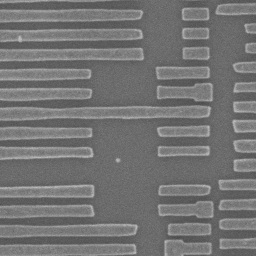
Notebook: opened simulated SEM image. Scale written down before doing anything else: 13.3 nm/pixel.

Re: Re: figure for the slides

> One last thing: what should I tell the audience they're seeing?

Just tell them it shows wiring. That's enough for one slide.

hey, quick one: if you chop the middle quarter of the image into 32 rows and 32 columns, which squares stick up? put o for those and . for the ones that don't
................................
oooooo.................ooooooooo
ooooooo................ooooooooo
ooo.....................ooo.....
................................
................................
ooooooo................ooooooooo
ooooooo................ooooooooo
oooooo..................o.......
................................
................................
oooooooooooooooooooooooooooooooo
oooooooooooooooooooooooooooooooo
....oooooo....ooooo.............
................................
................................
ooooooo................ooooooooo
ooooooo.................oooooooo
................................
................................
................................
ooooooo.................oooooooo
ooooooo.................oooooooo
................................
................................
................................
................................
................................
................................
................................
...oooo...................oooooo
ooooooo.................oooooooo